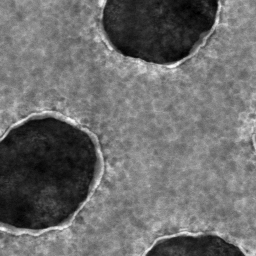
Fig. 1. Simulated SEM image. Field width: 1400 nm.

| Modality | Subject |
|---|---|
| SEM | holes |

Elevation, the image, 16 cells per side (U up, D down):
UUUUUUUDDDDDDDUU
UUUUUUDDDDDDDUUU
UUUUUUUDDDDDDUUU
UUUUUUUUDDDDUUUU
UUUUUUUUUUUUUUUU
UUUUUUUUUUUUUUUU
UUUUUUUUUUUUUUUU
UUDDUUUUUUUUUUUU
DDDDDUUUUUUUUUUU
DDDDDDUUUUUUUUUU
DDDDDDUUUUUUUUUU
DDDDDDUUUUUUUUUU
DDDDDUUUUUUUUUUU
DDDDUUUUUUUUUUUU
UUUUUUUUUUUUUUUU
UUUUUUUUUDDDDDDU